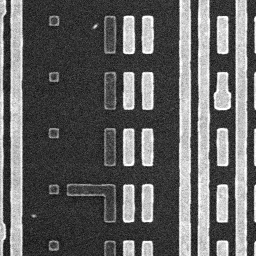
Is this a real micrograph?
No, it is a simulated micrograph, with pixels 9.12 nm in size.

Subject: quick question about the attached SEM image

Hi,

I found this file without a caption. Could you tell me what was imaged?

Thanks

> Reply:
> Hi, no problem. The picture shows wiring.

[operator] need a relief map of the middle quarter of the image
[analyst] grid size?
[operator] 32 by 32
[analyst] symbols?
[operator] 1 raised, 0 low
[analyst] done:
00000000000000000000000000000110
00000000000000000000000000000110
00000000001110011000110000000110
00000000001110011000110000000110
00000000001110011000110000000110
00000000001110011000110000000110
00000000001110011000110000000110
00000000001110011000110000000110
00000000001110011000110000000110
00000000001110011000110000000110
00000000001110011000110000000110
00000000000000000000000000000110
00000000000000000000000000000110
00000000000000000000000000000110
00000000000000000000000000000110
00000000000000000000000000000110
00000000001110011000110000000110
00000000001110011000110000000110
00000000001110011000110000000110
00000000001110011000110000000110
00000000001110011000110000000110
00000000001110011000110000000110
00000000001110011000110000000110
00000000001110011000110000000110
00000000001110011000110000000110
00000000000000000000000000000110
00000000000000000000000000000110
00000000000000000000000000000110
00000000000000000000000000000110
00000000000000000000000000000110
01111111111110011000110000000110
01111111111110011000110000000110